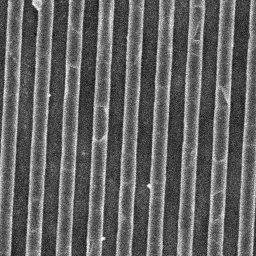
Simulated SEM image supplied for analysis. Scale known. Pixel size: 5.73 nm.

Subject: parallel lines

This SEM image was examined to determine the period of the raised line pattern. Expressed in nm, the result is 173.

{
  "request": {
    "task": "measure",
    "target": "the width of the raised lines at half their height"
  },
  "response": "86.5 nm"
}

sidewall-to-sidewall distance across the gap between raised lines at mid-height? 86.5 nanometers